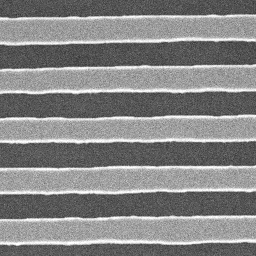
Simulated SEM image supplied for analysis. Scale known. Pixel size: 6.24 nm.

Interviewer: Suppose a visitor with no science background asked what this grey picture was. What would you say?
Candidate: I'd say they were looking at lines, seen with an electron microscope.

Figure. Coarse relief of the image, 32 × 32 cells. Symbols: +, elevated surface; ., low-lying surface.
................................
................................
++++++++++++++++++++++++++++++++
++++++++++++++++++++++++++++++++
++++++++++++++++++++++++++++++++
++++++++........................
................................
................................
........++++++++++++++++++++++++
++++++++++++++++++++++++++++++++
++++++++++++++++++++++++++++++++
+++++++.+++.....................
................................
................................
.............................+++
++++++++++++++++++++++++++++++++
++++++++++++++++++++++++++++++++
++++++++++++++++++++++++++++++++
................................
................................
................................
++++++++++++++++++++++++++++++++
++++++++++++++++++++++++++++++++
++++++++++++++++++++++++++++++++
................................
................................
................................
++++++++++++++++++++++++++++++++
++++++++++++++++++++++++++++++++
++++++++++++++++++++++++++++++++
+++++..++++.........++++........
................................